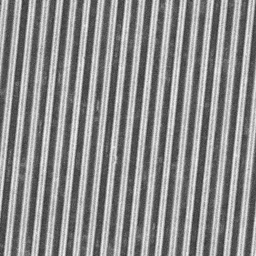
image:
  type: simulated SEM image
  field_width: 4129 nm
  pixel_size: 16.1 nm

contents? parallel lines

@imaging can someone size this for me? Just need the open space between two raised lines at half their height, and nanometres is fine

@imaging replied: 128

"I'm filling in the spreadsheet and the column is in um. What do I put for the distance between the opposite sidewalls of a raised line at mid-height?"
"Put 0.0863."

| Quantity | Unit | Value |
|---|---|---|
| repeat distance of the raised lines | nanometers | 220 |